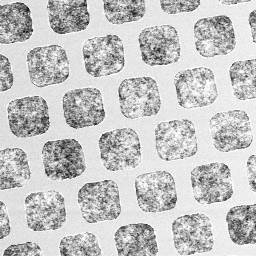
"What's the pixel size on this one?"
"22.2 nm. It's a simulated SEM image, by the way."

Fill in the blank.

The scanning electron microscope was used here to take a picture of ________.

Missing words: a regular array of holes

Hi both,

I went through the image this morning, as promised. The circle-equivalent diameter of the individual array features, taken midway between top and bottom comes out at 964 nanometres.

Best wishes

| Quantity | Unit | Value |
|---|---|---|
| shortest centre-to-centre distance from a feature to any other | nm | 1220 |